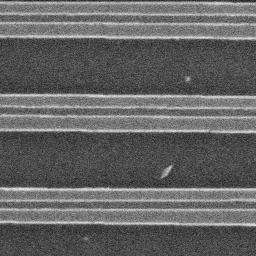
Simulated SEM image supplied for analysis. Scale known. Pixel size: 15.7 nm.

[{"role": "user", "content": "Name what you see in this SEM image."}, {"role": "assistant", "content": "lines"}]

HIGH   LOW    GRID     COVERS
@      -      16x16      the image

@@@@@@@@@@@@@@@@
@@@@@@@@@@@@@@@@
----------------
----------------
----------------
----------------
@@@@@@@@@@@@@@@@
@@@@@@@@@@@@@@@@
----------------
----------------
----------------
----------------
@@@@@@@@@@@@@@@@
@@@@@@@@@@@@@@@@
----------------
----------------